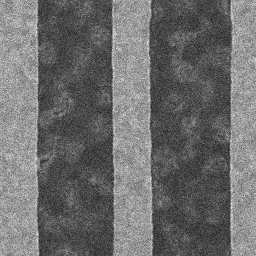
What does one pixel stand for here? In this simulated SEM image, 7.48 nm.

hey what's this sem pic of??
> one or a few lines or trenches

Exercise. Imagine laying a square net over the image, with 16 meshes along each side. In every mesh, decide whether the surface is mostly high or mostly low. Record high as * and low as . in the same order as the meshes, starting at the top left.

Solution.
**.....**.....**
**.....**.....**
**.....**......*
**.....**......*
**.....**......*
**.....**......*
**.....**.....**
**.....**.....**
**.....**.....**
**.....**.....**
**.....**.....**
**.....**.....**
**.....**.....**
**.....**.....**
**.....**.....**
**.....**.....**